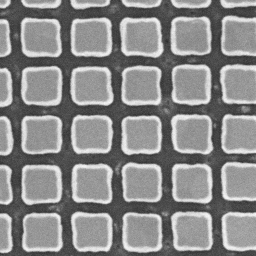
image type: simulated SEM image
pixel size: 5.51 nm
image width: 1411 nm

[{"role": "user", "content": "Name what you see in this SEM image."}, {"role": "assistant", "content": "a regular array of raised bodies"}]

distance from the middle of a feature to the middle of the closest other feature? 265 nm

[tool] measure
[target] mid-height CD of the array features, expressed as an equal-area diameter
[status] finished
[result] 222 nm